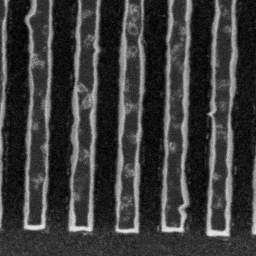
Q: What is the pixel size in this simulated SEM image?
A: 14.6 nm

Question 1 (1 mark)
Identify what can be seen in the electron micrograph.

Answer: parallel lines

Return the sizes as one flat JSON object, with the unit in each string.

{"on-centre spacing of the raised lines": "668 nanometers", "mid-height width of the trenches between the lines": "385 nm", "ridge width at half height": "284 nm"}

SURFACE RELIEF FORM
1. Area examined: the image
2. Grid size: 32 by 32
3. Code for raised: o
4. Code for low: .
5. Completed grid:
o...oo....oo....oo...ooo...oo...
o...oo....oo....oo...ooo...oo...
o..ooo....oo....oo...ooo...oo...
o...oo....oo...ooo...ooo...oo...
o...oo....oo...ooo...ooo...oo...
o...oo....oo...ooo...ooo...oo...
o...oo....oo...ooo...oo....oo...
o...oo...ooo...ooo...oo....oo...
o...oo...ooo...ooo...oo....oo...
o...oo....oo...ooo...oo....oo...
o...oo...ooo...ooo...oo....oo...
o...oo...ooo...ooo...oo....oo...
....oo...ooo...ooo...oo....oo...
....oo...ooo...oo....oo....oo...
....oo...ooo...oo....oo...ooo...
....oo....oo...ooo...oo....oo...
....oo...ooo...ooo...oo....oo...
...ooo...ooo...oo....oo....oo...
....oo...ooo...oo....oo...ooo...
....oo...ooo...oo....oo...ooo...
....oo...ooo...oo....oo...ooo...
...ooo...ooo...oo....oo...ooo...
...ooo...ooo...oo....oo...ooo...
...ooo...oo....oo....oo...ooo...
...ooo...oo....oo....oo...ooo...
...ooo...oo....oo...ooo...ooo...
...ooo...oo....oo...ooo...ooo...
...oo....oo....oo...ooo...ooo...
...oo.....o....oo...ooo...oo....
................................
................................
................................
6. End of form